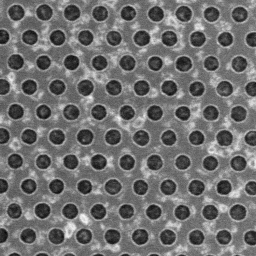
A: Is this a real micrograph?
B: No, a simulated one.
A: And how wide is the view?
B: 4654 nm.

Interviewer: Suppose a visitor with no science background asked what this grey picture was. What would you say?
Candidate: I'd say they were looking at a regular array of holes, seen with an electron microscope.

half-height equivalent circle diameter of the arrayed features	297	nanometers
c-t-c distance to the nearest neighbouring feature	504	nm